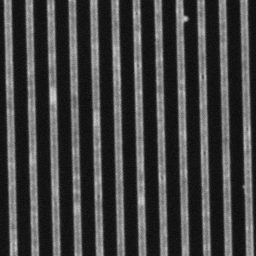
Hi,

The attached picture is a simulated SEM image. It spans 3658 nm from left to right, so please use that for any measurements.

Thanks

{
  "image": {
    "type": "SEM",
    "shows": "parallel lines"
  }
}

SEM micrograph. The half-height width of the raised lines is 6.25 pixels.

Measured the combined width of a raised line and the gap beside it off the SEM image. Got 307 nanometres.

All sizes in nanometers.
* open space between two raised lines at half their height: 216